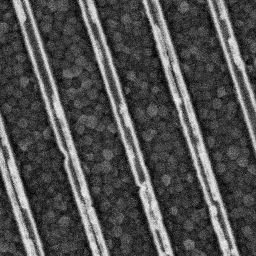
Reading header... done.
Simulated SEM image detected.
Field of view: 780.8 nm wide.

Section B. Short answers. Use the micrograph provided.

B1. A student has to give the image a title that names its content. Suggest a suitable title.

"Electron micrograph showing one or a few lines or trenches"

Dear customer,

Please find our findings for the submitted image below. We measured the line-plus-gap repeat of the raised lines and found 189 nm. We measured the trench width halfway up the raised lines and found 155 nanometres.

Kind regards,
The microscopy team